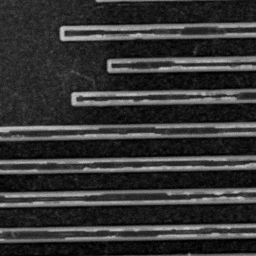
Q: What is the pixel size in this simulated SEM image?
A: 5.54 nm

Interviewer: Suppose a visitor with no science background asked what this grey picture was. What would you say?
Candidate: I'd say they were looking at parallel lines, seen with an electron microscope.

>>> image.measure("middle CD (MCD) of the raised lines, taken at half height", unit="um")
0.0658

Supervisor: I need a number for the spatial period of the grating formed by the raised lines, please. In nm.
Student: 186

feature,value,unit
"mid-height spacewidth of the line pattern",116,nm